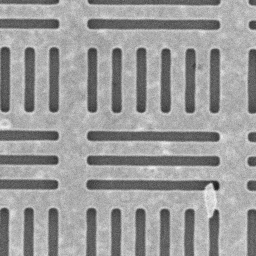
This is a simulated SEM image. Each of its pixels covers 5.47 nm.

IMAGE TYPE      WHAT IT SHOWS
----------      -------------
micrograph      groups of lines, slits or small figures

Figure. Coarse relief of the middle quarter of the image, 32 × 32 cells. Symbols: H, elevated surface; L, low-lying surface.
HHHHHHLLLHHHLLLHHHLLLHHHLLLHHHLL
HHHHHHLLLHHHLLLHHHLLLHHHLLLHHHLL
HHHHHHLLLHHHLLLHHHLLLHHHLLLHHHLL
HHHHHHLLLHHHLLLHHHLLLHHHLLLHHHLL
HHHHHHLLLHHHLLLHHHLLLHHHLLLHHHLL
HHHHHHLLLHHHLLLHHHLLLHHHLLLHHHLL
HHHHHHLLLHHHLLLHHHLLLHHHLLLHHHLL
HHHHHHLLLHHHLLLHHHLLLHHHLLLHHHLL
HHHHHHLLLHHHLLLHHHLLLHHHLLLHHHLL
HHHHHHLLLHHHLLLHHHLLLHHHLLLHHHLL
HHHHHHLLLHHHLLLHHHLLLHHHLLLHHHLL
HHHHHHLLHHHHLLHHHHLLLHHHLLLHHHLL
HHHHHHHHHHHHHLHHHHHLHHHHHLHHHHHL
HHHHHHHHHHHHHHHHHHHHHHHHHHHHHHHH
HHHHHHHHHHHHHHHHHHHHHHHHHHHHHHHH
HHHHHHHHHHHHHHHHHHHHHHHHHHHHHHHH
HHHHHHHHHHHHHHHHHHHHHHHHHHHHHHHH
HHHHHHLLLLLLLLLLLLLLLLLLLLLLLLLL
HHHHHHLLLLLLLLLLLLLLLLLLLLLLLLLL
HHHHHHHLLLLLLLLLLLLLLLLLLLLLLLLL
HHHHHHHHHHHHHHHHHHHHHHHHHHHHHHHH
HHHHHHHHHHHHHHHHHHHHHHHHHHHHHHHH
HHHHHHHHHHHHHHHHHHHHHHHHHHHHHHHH
HHHHHHLLLLLLLLLLLLLLLLLLLLLLLLLL
HHHHHHLLLLLLLLLLLLLLLLLLLLLLLLLL
HHHHHHHHHHHHLLLLLLLLLLLLLLLLLLLL
HHHHHHHHHHHHHHHHHHHHHHHHHHHHHHHH
HHHHHHHHHHHHHHHHHHHHHHHHHHHHHHHH
HHHHHHHHHHHHHHHHHHHHHHHHHHHHHHHH
HHHHHHLLLLLLLLLLLLLLLLLLLLLLLLLL
HHHHHLLLLLLLLLLLLLLLLLLLLLLLLLLL
HHHHHHLLLLLLLLLLLLLLLLLLLLLLLLLL